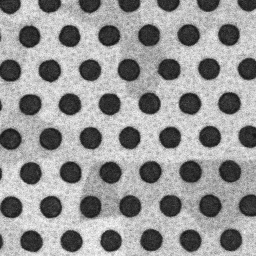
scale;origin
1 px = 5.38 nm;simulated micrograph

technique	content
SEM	a regular array of holes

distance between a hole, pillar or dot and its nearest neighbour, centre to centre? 211 nm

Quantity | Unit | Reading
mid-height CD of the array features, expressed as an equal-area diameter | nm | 120